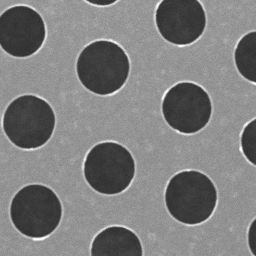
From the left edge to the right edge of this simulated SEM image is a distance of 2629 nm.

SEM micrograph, holes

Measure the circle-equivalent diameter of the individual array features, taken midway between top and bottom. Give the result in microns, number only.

0.538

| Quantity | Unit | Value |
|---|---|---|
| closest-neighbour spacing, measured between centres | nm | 903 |